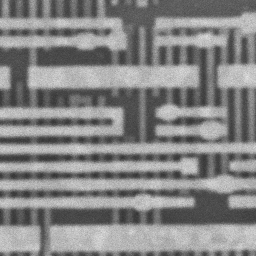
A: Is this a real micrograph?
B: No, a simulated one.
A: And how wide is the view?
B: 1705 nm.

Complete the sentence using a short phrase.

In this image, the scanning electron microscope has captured wiring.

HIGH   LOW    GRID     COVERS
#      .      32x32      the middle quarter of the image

..............................##
################################
################################
################################
################################
################################
................................
................................
................................
................................
.........................##.....
###############........#########
###############........#########
............###.........####....
............###.................
............###........####.....
###############........#########
###############........#########
................................
................................
################################
################################
................................
................................
####.........#######.........###
################################
############################.###
................................
................................
################################
################################
#######.........................